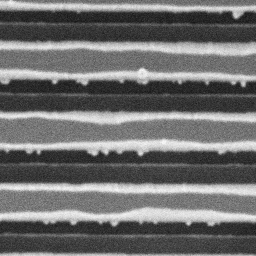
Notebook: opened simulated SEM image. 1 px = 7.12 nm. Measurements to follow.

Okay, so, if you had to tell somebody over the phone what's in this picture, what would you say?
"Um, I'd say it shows lines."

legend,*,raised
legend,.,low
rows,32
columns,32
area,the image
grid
********************************
................................
................................
................................
................................
*****.******....................
********************************
********************************
********************************
********************************
................................
................................
................................
................................
********************************
********************************
********************************
********************************
....**..................********
................................
................................
................................
................................
********************************
********************************
********************************
********************************
................................
................................
................................
................................
................................